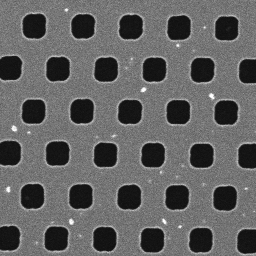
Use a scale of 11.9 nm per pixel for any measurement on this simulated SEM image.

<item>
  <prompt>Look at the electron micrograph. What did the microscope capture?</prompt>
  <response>a regular array of holes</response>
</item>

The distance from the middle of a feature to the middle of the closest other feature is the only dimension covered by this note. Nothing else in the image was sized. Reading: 571 nm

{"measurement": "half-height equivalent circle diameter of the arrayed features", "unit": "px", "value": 25.7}